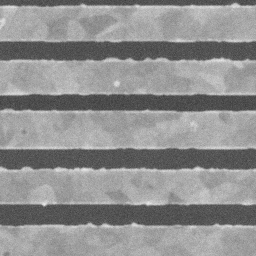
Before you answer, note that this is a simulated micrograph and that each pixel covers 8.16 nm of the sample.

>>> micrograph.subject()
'lines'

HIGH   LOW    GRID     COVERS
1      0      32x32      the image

00000000000000000000000000000000
11111111111111111111111111111111
11111111111111111111111111111111
11111111111111111111111111111111
11111111111111111111111111111111
00000000000000000000000000000000
00000000000000000000000000000000
00000000000000000000000000000000
11111111111111111111111111111111
11111111111111111111111111111111
11111111111111111111111111111111
11111111111111111111111111111111
00000000000000000000000000000000
00000000000000000000000000000000
11111111111111111111111111111111
11111111111111111111111111111111
11111111111111111111111111111111
11111111111111111111111111111111
11111111111111100111101111111110
00000000000000000000000000000000
00000000000000000000000000000000
11111111111111111111111111111111
11111111111111111111111111111111
11111111111111111111111111111111
11111111111111111111111111111111
00000100000000001111100000000011
00000000000000000000000000000000
00000000000000000000000000000000
11111111111111111111111111111111
11111111111111111111111111111111
11111111111111111111111111111111
11111111111111111111111111111111